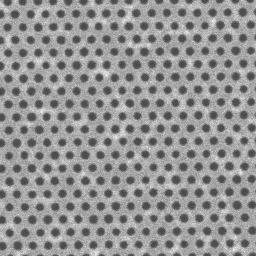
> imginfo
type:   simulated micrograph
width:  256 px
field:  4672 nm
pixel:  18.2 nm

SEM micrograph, a regular array of holes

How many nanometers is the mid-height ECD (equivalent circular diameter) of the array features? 163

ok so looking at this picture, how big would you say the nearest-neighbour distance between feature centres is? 266 nm